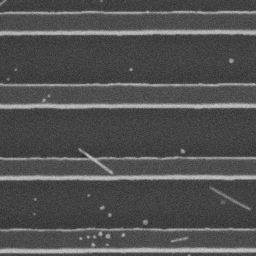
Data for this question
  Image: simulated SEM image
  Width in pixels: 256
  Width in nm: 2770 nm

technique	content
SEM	lines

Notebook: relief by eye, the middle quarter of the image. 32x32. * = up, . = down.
................................
................................
................................
................................
................................
********************************
********************************
********************************
********************************
********************************
************************....*.**
................................
................................
................................
................................
................................
................................
................................
................................
................................
................................
................................
................................
.....***.**.....**.****..*******
********************************
********************************
********************************
********************************
*************************.......
................................
................................
................................